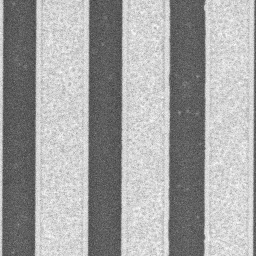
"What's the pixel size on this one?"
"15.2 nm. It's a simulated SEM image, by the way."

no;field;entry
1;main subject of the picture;one or a few lines or trenches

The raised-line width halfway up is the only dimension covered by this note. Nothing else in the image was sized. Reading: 671 nm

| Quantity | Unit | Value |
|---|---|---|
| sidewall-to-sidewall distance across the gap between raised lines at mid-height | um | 0.595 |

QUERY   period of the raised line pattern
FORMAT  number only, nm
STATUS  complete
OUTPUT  1280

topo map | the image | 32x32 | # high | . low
.....######.....#####.....#####.
.....######.....#####.....#####.
.....######.....#####.....#####.
.....######.....#####.....#####.
.....######.....#####.....#####.
.....######.....#####.....#####.
.....######.....#####.....#####.
.....######.....#####.....#####.
.....######.....#####.....#####.
.....######.....#####.....#####.
.....######.....#####.....#####.
.....######.....#####.....#####.
.....######.....#####.....#####.
.....######.....#####.....#####.
.....######.....#####.....#####.
.....######.....#####.....#####.
.....######.....#####.....#####.
.....######.....#####.....#####.
.....######.....#####.....#####.
.....######.....#####.....#####.
.....######.....#####.....#####.
.....######.....#####.....#####.
.....######.....#####.....#####.
.....######.....#####.....#####.
.....######.....#####.....#####.
.....######.....#####.....#####.
.....######.....#####.....#####.
.....######.....#####.....#####.
.....######.....#####.....#####.
.....######.....#####.....#####.
.....######.....#####.....#####.
.....######.....#####.....#####.